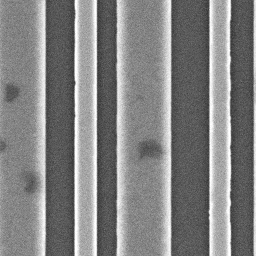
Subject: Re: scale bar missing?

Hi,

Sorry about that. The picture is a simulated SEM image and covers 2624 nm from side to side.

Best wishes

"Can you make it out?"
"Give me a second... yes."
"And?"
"lines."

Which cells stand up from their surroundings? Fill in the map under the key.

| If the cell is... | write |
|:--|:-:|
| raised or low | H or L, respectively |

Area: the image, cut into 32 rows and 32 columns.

HHHHHHLLLLHHLLLHHHHHHLLLLLHHHLLL
HHHHHHLLLLHHLLLHHHHHHLLLLLHHHLLL
HHHHHHLLLLHHLLLHHHHHHLLLLLHHHLLL
HHHHHHLLLLHHLLLHHHHHHLLLLLHHHLLL
HHHHHHLLLLHHLLLHHHHHHLLLLLHHHLLL
HHHHHHLLLLHHLLLHHHHHHLLLLLHHHLLL
HHHHHHLLLLHHLLLHHHHHHLLLLLHHHLLL
HHHHHHLLLHHHLLLHHHHHHLLLLLHHHLLL
HHHHHHLLLLHHLLLHHHHHHLLLLLHHHLLL
HHHHHHLLLLHHLLLHHHHHHLLLLLHHHLLL
HHHHHHLLLLHHLLLHHHHHHLLLLLHHHLLL
HHHHHHLLLLHHLLLHHHHHHLLLLLHHHLLL
HHHHHHLLLLHHLLLHHHHHHLLLLLHHHLLL
HHHHHHLLLLHHLLLHHHHHHLLLLLHHHLLL
HHHHHHLLLLHHLLLHHHHHHLLLLLHHHLLL
HHHHHHLLLLHHLLLHHHHHHLLLLLHHHLLL
HHHHHHLLLLHHLLLHHHHHHLLLLLHHHLLL
HHHHHHLLLHHHLLLHHHHHHLLLLLHHHLLL
HHHHHHLLLHHHLLLHHHHHHLLLLLHHHLLL
HHHHHHLLLHHHLLLHHHHHHLLLLLHHHLLL
HHHHHHLLLHHHLLLHHHHHHLLLLLHHHLLL
HHHHHHLLLHHHLLLHHHHHHLLLLLHHHLLL
HHHHHHLLLHHHLLLHHHHHHLLLLLHHHLLL
HHHHHHLLLLHHLLLHHHHHHLLLLLHHHLLL
HHHHHHLLLLHHLLLHHHHHHLLLLLHHHLLL
HHHHHHLLLLHHLLLHHHHHHLLLLLHHHLLL
HHHHHHLLLHHHLLLHHHHHHLLLLLHHHLLL
HHHHHHLLLLHHLLLHHHHHHLLLLLHHHLLL
HHHHHHLLLHHHLLLHHHHHHLLLLLHHHLLL
HHHHHHLLLHHHLLLHHHHHHLLLLLHHHLLL
HHHHHHLLLHHHLLLHHHHHHLLLLLHHHLLL
HHHHHHLLLLHHLLLHHHHHHLLLLLHHHLLL